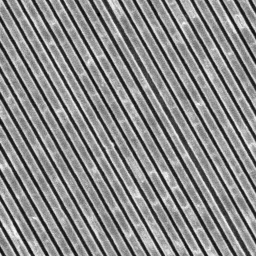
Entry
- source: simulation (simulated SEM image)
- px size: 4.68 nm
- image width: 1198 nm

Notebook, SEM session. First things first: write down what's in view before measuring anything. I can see parallel lines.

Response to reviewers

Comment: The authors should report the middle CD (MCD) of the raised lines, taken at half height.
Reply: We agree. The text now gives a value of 36.6 nm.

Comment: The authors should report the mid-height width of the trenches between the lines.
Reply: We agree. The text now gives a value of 3.91 px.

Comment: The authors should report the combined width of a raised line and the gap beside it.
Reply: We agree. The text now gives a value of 12.6 px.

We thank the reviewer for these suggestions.